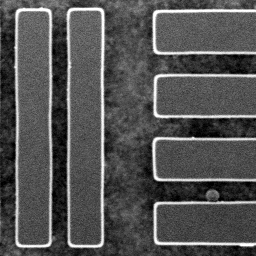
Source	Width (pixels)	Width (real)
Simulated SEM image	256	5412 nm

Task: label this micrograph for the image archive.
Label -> groups of lines, slits or small figures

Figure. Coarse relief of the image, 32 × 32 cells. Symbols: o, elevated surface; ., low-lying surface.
................................
..oooo...oooo.......oooooooooooo
..oooo...oooo......ooooooooooooo
..oooo...oooo......ooooooooooooo
..oooo...oooo......ooooooooooooo
..oooo...oooo......ooooooooooooo
..oooo...oooo.......oooooooooooo
..oooo...oooo...................
..oooo...oooo...................
..oooo...oooo........oooo.......
..oooo...oooo......ooooooooooooo
..oooo...oooo......ooooooooooooo
..oooo...oooo......ooooooooooooo
..oooo...oooo......ooooooooooooo
..oooo...oooo.......oooooooooooo
..oooo...oooo...................
..oooo...oooo...................
..oooo...oooo.......oooooooooooo
..oooo...oooo......ooooooooooooo
..oooo...oooo......ooooooooooooo
..oooo...oooo......ooooooooooooo
..oooo...oooo......ooooooooooooo
..oooo...oooo................ooo
..oooo...oooo...................
..oooo...oooo...................
..oooo...oooo.......oooooooooooo
..oooo...oooo......ooooooooooooo
..oooo...oooo......ooooooooooooo
..oooo...oooo......ooooooooooooo
..oooo...oooo......ooooooooooooo
..oooo...oooo...................
................................